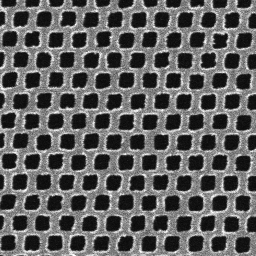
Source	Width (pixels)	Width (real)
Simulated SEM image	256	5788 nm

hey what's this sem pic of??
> a regular array of holes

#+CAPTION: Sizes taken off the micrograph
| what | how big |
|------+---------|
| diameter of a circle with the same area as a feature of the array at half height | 0.378 µm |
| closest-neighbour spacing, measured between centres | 518 nm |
